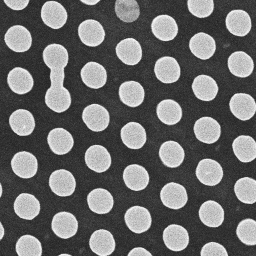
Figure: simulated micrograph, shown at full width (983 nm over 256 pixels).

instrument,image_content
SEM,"a regular array of raised bodies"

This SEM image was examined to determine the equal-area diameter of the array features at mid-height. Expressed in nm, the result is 101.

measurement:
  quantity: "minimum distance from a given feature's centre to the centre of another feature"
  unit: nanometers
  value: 160